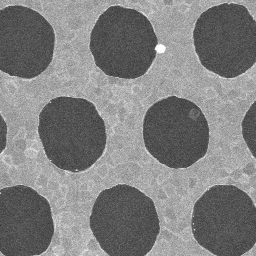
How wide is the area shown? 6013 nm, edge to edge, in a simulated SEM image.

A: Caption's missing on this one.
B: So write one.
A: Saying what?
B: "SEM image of holes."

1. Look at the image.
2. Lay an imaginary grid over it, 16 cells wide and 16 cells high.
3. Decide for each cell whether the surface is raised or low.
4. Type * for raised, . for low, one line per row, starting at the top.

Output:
..*****.*****..*
...***...***....
...***....**....
...***....**....
...***...****..*
****************
***...****..****
**....***....**.
**.....**....**.
***...***....***
****..**********
****************
...***...***....
...***....**....
...***....**....
...***...****...